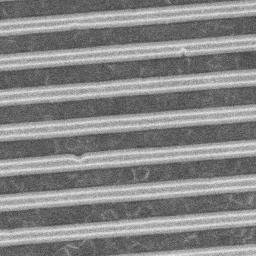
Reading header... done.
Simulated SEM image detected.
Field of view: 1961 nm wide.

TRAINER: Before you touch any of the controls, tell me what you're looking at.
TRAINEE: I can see parallel lines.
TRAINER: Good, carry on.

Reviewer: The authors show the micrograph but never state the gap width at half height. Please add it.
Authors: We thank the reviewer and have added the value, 176 nanometers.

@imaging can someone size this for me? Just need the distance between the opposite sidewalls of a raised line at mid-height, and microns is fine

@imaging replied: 0.0887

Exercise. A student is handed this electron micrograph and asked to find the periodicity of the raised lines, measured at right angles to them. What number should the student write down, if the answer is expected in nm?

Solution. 267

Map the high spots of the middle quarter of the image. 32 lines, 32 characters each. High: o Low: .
................................
................................
................................
............................oooo
................oooooooooooooooo
...ooooooooooooooooooooooooooooo
ooooooooooooooooooooooooooo.....
oooooooooooooo..................
oo..............................
................................
................................
................................
...........................ooooo
..............oooooooooooooooooo
..oooooooooooooooooooooooooooooo
ooooooooooooooooooooooo.........
oooooooooo......................
o...............................
................................
................................
................................
......................oooooooooo
..........oooooooooooooooooooooo
ooo.ooooooooooooooooooooooooooo.
ooooooooooooooooooooo...........
oooooooo........................
................................
................................
................................
...............................o
...................o.ooooooooooo
......oooooooooooooooooooooooooo